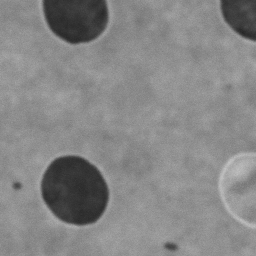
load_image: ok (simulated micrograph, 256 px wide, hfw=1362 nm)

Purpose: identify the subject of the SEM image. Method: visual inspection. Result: holes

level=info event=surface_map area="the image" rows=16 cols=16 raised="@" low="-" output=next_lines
@@@----@@@@@@@--
@@@----@@@@@@@--
@@@@--@@@@@@@@@@
@@@@@@@@@@@@@@@@
@@@@@@@@@@@@@@@@
@@@@@@@@@@@@@@@@
@@@@@@@@@@@@@@@@
@@@@@@@@@@@@@@@@
@@@@@@@@@@@@@@@@
@@@@@@@@@@@@@@@@
@@@---@@@@@@@@@@
@@@----@@@@@@@@@
@@@----@@@@@@@@@
@@@---@@@@@@@@@@
@@@@@@@@@@@@@@@@
@@@@@@@@@@@@@@@@